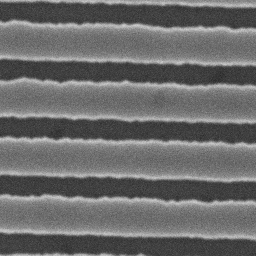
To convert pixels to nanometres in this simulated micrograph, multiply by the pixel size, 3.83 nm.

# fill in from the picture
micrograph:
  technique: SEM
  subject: lines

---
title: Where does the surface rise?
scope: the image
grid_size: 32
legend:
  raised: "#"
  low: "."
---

....................#.##########
................................
................................
####################.......#....
################################
################################
################################
....############################
................................
................................
######################..........
################################
################################
################################
################################
................................
................................
##########..#...................
################################
################################
################################
################################
..........................######
................................
#....#..........................
################################
################################
################################
################################
........................########
................................
................................